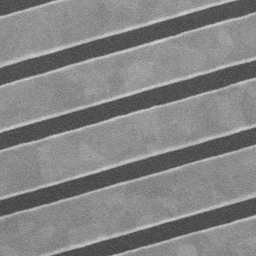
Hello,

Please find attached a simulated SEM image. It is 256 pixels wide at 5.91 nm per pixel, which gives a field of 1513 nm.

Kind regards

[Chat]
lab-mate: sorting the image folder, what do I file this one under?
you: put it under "lines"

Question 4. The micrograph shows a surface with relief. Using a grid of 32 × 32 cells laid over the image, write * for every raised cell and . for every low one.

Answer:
......**********************....
..**********************........
*********************........***
*****************........*******
*************.........**********
**********........**************
******.........*****************
***........*********************
........********************....
....*********************.......
.********************........***
*****************.........******
**************.........*********
***********........*************
*******.........****************
****........********************
.........*********************..
.....*********************......
.*********************.........*
*******************........*****
****************........********
************........************
*********........***************
*****........*******************
*.........**********************
......***********************...
..***********************.......
**********************........**
******************.........*****
***************........*********
***********.........************
*******.........****************